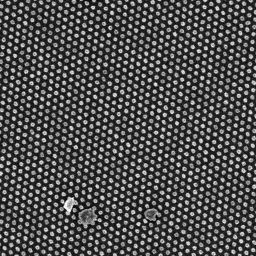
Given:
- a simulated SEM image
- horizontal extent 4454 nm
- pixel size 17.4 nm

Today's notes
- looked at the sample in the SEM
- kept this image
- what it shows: a regular array of raised bodies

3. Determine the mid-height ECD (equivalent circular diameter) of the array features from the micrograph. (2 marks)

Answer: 68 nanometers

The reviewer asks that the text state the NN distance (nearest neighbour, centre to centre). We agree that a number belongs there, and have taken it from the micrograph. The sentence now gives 123 nm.